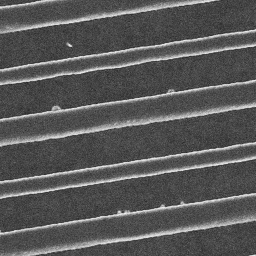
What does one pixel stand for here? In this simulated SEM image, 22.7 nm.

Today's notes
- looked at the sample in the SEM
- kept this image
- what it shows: lines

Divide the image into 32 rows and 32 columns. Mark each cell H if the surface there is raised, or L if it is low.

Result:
LLLHHHHHHHHHHHHHHHHHHHHLLLLLLLLL
HHHHHHHHHHHHHHHHHLLLLLLLLLLLLLLL
HHHHHHHHHHHLLLLLLLLLLLLLLLLLLLLL
HHHLLLLLLLLLLLLLLLLLLLLLLLLLLLLL
LLLLLLLLLLLLLLLLLLLLLLLLLLHHHHHH
LLLLLLLLLLLLLLLLLLLLLHHHHHHHHHHH
LLLLLLLLLLLLLLHHHHHHHHHHHHHLLLLL
LLLLLLLLHHHHHHHHHHHHLLLLLLLLLLLL
LLHHHHHHHHHHHHLLLLLLLLLLLLLLLLLL
HHHHHHHLLLLLLLLLLLLLLLLLLLLLLLLL
LLLLLLLLLLLLLLLLLLLLLLLLLLLLHHHH
LLLLLLLLLLLLLLLLLLLLLLHHHHHHHHHH
LLLLLLLLLLLLLLLLHHHHHHHHHHHHHHHH
LLLLLLLLLHHHHHHHHHHHHHHHHHHHHHLL
LLLHHHHHHHHHHHHHHHHHHHHHLLLLLLLL
HHHHHHHHHHHHHHHHHLLLLLLLLLLLLLLL
HHHHHHHHHHHLLLLLLLLLLLLLLLLLLLLL
HHHHLLLLLLLLLLLLLLLLLLLLLLLLLLLL
LLLLLLLLLLLLLLLLLLLLLLLLLLLLHHHH
LLLLLLLLLLLLLLLLLLLLLHHHHHHHHHHH
LLLLLLLLLLLLLLLHHHHHHHHHHHHHLLLL
LLLLLLLLLHHHHHHHHHHHHLLLLLLLLLLL
LLHHHHHHHHHHHHHLLLLLLLLLLLLLLLLL
HHHHHHHHLLLLLLLLLLLLLLLLLLLLLLLL
HLLLLLLLLLLLLLLLLLLLLLLLLLLLLLHH
LLLLLLLLLLLLLLLLLLLLLLLHHHHHHHHH
LLLLLLLLLLLLLLLLLHHHHHHHHHHHHHHH
LLLLLLLLLLHHHHHHHHHHHHHHHHHHHHHL
LLLLHHHHHHHHHHHHHHHHHHHHHLLLLLLL
HHHHHHHHHHHHHHHHHHHLLLLLLLLLLLLL
HHHHHHHHHHHHLLLLLLLLLLLLLLLLLLLL
HHHHHHLLLLLLLLLLLLLLLLLLLLLLLLLL